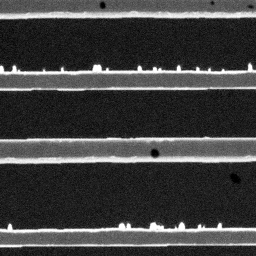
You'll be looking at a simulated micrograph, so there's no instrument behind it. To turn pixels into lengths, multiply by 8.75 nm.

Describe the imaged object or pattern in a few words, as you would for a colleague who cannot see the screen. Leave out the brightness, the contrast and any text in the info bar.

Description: lines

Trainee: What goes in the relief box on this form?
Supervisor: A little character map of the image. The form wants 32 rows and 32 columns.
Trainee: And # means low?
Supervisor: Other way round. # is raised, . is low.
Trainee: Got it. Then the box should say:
################################
################################
................................
................................
................................
................................
................................
................................
................................
################################
################################
................................
................................
................................
................................
................................
................................
....############################
################################
################################
................................
................................
................................
................................
................................
................................
................................
................................
...............#...#..#.........
################################
################################
................................